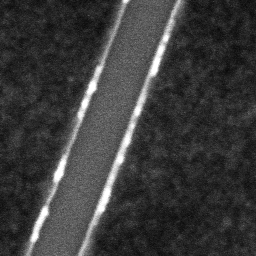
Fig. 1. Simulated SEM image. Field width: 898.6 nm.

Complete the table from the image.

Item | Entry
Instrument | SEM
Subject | one or a few lines or trenches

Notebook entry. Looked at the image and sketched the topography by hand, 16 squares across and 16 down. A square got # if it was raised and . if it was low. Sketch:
########...#####
#######....#####
#######...######
#######...######
######...#######
######...#######
#####....#######
#####...########
#####...########
####...#########
####...#########
####...#########
###...##########
###...##########
##....##########
##...###########